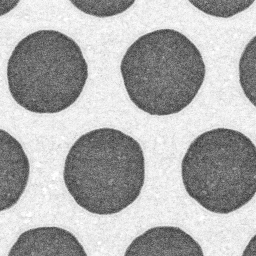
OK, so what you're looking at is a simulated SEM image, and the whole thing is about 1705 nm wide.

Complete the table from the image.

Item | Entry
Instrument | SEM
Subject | holes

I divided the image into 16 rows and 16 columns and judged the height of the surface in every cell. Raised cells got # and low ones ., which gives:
.####...####...#
################
#...#####...####
#....###.....##.
.....###.....##.
#....###....###.
#....###....####
################
.####...####...#
..##.....###....
..##.....##.....
..##.....##.....
.####...####....
################
##..#####...####
#....###.....##.